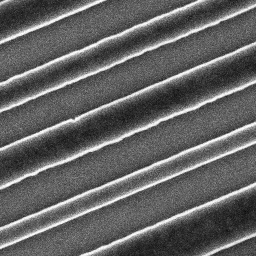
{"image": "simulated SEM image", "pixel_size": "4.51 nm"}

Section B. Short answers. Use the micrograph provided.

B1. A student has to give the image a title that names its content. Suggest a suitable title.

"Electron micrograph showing one or a few lines or trenches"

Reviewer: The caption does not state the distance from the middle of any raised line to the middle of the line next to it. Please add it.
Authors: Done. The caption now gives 296 nm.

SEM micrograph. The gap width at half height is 166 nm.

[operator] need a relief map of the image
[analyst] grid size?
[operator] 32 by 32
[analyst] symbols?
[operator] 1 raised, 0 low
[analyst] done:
11111111111100000000000011111111
11111111100000000000011111111100
11111110000000000001111111110000
11111000000000000111111110000000
11000000000000111111111000000000
00000000000011111111100000000000
00000000001111111100000000000111
00000001111111110000000000011111
00000111111111000000000011111111
00111111111000000000001111111111
11111111000000000001111111111110
11111100000000000111111111111000
11100000000000011111111111100000
10000000000011111111111110000000
00000000001111111111110000000000
00000001111111111110000000000000
00000111111111111000000000000111
00011111111111100000000000011111
11111111111100000000000011111100
11111111110000000000001111110000
11111110000000000001111110000000
11111000000000000111111000000000
11000000000000011111100000000000
00000000000011111100000000000001
00000000001111110000000000001111
00000001111110000000000000111111
00000111111000000000000111111111
00111111100000000000011111111111
11111100000000000001111111111111
11110000000000001111111111111111
10000000000000111111111111111000
00000000000011111111111111100000